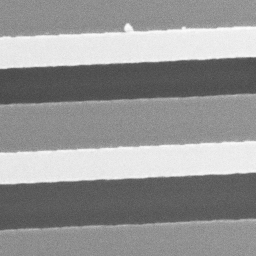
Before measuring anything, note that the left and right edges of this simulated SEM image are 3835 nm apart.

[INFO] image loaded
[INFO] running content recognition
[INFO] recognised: lines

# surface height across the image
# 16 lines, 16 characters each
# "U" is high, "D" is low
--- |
UUUUUUUUUUUUUUUU
UUUUUUUUUUUUUUUU
UUUUUUUUUUUUUUUU
UUUUUUUUUUUUUUUU
DDDDDDDDDDDDDDDD
DDDDDDDDDDDDDDDD
DDDUUUUUUUUUUUUU
UUUUUUUUUUUUUUUU
UUUUUUUUUUUUUUUU
UUUUUUUUUUUUUUUU
UUUUUUUUUUUUUUUU
DDDDDDDDDDDDDDDD
DDDDDDDDDDDDDDDD
DDDDDDDDDDDDDDDD
UUUUUUUUUUUUUUUU
UUUUUUUUUUUUUUUU